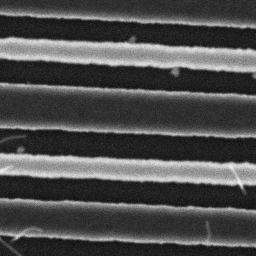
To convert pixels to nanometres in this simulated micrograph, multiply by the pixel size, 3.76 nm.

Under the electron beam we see lines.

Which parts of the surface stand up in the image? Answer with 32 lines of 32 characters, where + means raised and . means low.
++++++++++++++++++++++++++++++++
++++++++++++++++++++++++++++++++
...............+++++++++++++++++
................................
................................
++++++++++++.+..................
++++++++++++++++++++++++++++++++
......++++++++++++++++++++++++++
........................++++++++
................................
+...............................
+++++++++++++++++++++...........
++++++++++++++++++++++++++++++++
++++++++++++++++++++++++++++++++
++++++++++++++++++++++++++++++++
++++++++++++++++++++++++++++++++
..............++++++++++++++++++
................................
................................
++++............................
+++++++++++++++++++++++++++.+...
++++++++++++++++++++++++++++++++
.................+.+++++++++++++
................................
................................
++++++++++++++++................
++++++++++++++++++++++++++++++++
++++++++++++++++++++++++++++++++
++++++++++++++++++++++++++++++++
..++++++++++++++++++++++++++++++
.......................+++++++++
................................